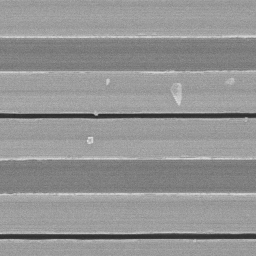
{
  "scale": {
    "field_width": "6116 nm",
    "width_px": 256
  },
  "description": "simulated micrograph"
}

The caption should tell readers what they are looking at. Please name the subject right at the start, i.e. lines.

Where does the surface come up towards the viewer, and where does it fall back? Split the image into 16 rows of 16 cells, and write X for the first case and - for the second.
XXXXXXXXXXXXXXXX
XXXXXXXXXXXXXXXX
----------------
----------------
---------------X
XXXXXXXXXXXXXXXX
XXXXXXXXXXXXXXXX
XXXXXXXXXXXXXXXX
XXXXXXXXXXXXXXXX
XXXXXXXXXXXXXXXX
----------------
----------------
XXXXXXXXXXXXXXXX
XXXXXXXXXXXXXXXX
XXXXXXXXXXXXXXXX
XXXXXXXXXXXXXXXX